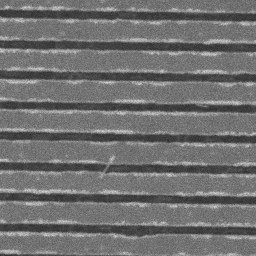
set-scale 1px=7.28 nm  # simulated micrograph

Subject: parallel lines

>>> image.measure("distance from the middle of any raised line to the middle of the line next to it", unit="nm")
222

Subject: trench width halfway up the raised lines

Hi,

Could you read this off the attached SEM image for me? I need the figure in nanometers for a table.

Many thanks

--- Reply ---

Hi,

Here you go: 65.5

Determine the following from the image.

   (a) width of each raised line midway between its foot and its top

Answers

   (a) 157 nm